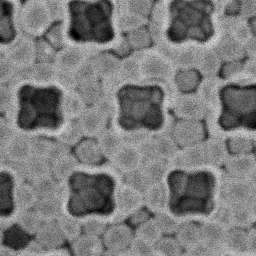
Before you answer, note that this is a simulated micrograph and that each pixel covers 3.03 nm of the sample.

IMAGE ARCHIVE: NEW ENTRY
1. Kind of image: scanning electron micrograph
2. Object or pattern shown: holes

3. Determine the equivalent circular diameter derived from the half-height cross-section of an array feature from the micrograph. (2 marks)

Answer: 145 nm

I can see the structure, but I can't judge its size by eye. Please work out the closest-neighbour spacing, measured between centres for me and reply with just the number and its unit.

298 nm